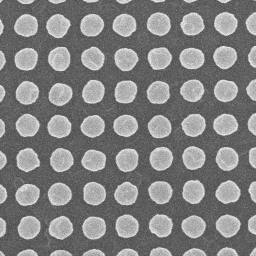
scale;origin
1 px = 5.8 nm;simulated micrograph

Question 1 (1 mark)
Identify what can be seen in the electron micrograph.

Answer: a regular array of raised bodies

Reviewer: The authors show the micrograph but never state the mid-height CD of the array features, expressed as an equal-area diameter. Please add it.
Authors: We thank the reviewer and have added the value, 131 nanometres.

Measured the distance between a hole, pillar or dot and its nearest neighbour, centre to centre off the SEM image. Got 189 nanometers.